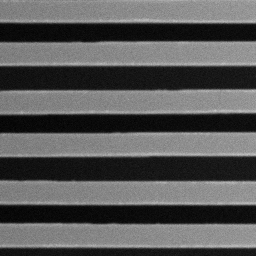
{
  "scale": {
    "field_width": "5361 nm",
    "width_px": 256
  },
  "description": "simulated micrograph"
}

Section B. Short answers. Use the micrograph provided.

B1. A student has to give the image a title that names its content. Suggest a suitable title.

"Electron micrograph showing lines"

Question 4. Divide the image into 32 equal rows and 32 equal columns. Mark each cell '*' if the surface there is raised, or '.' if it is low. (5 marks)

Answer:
********************************
********************************
********************************
................................
................................
********************************
********************************
********************************
................................
................................
................................
********************************
********************************
********************************
................................
................................
................................
********************************
********************************
*************...................
................................
................................
................................
********************************
********************************
********************************
................................
................................
********************************
********************************
********************************
................................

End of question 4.